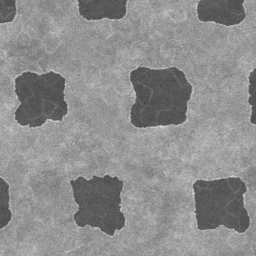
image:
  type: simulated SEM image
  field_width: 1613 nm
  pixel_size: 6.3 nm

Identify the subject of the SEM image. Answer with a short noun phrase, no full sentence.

holes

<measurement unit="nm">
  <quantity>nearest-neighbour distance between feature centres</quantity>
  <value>755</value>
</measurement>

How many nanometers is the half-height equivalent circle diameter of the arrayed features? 360